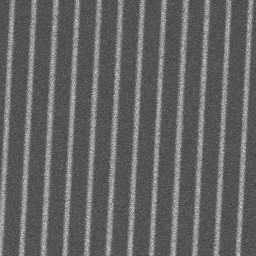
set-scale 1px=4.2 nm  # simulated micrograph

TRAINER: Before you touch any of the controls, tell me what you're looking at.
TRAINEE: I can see parallel lines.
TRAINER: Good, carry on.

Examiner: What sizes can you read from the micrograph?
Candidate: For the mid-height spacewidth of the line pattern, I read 70.2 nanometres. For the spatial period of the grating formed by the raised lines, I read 0.0908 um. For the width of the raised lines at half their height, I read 19.4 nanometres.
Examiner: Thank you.